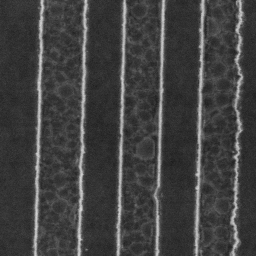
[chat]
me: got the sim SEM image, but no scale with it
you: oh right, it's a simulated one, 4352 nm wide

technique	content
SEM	one or a few lines or trenches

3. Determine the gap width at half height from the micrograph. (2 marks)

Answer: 652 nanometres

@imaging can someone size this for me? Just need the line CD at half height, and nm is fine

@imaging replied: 671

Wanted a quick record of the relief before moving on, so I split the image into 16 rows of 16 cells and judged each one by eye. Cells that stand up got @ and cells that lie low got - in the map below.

@@@--@@@--@@@--@
@@@--@@@--@@@--@
@@@--@@@--@@@--@
@@@--@@@--@@@--@
@@@--@@@--@@@--@
@@---@@@--@@@--@
@@---@@@--@@@--@
@@---@@@--@@---@
@@---@@@--@@---@
@@---@@@--@@---@
@@---@@@--@@---@
@@---@@@--@@---@
@@---@@---@@---@
@@---@@---@@---@
@@---@@---@@---@
@@---@@---@@---@